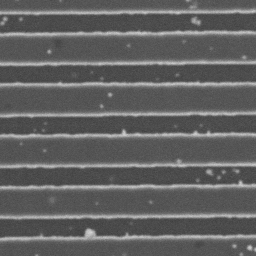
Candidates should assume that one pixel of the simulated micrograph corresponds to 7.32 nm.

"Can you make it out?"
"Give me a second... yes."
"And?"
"lines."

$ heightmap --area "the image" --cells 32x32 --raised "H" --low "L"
HHHHHHHHHHHHHHHHHHHHHHHHHHHHHHHH
HHHHHHHHHHHHHHHHHHHHHHHHHHHHHLHL
LLLLLLLLLLLLLLLLLLLLLLLLLLLLLLLL
LLLLLLLLLLLLLLLLLLLLLLLLLLLLLLLL
HHHHHHHHHHHHHHHHHHHHHHHHHHHHHHHH
HHHHHHHHHHHHHHHHHHHHHHHHHHHHHHHH
HHHHHHHHHHHHHHHHHHHHHHHHHHHHHHHH
HHHHHHHHHHHHHHHHHHHHHHHHHHHHHHHH
LLLLLLLLLLLLLLLLLLLLLLLLLLLLLLLL
LLLLLLLLLLLLLLLLLLLLLLLLLLLLLLLL
HHHHHHHHHHHHHHHHHHHHHHHHHHHHHHHH
HHHHHHHHHHHHHHHHHHHHHHHHHHHHHHHH
HHHHHHHHHHHHHHHHHHHHHHHHHHHHHHHH
HHHHHHHHHHHHHHHHHHHHHHHHHHHHHHHH
HLLLLLLLLLLLLLLLLLLLLLLLLLLLLLLL
LLLLLLLLLLLLLLLLLLLLLLLLLLLLLLLL
LLLLLLLLLLLLLLLLLLLLLLLLLLLLLLLL
HHHHHHHHHHHHHHHHHHHHHHHHHHHHHHHH
HHHHHHHHHHHHHHHHHHHHHHHHHHHHHHHH
HHHHHHHHHHHHHHHHHHHHHHHHHHHHHHHH
HHHHHHHHHHHHHHHHHHHHHHHHHHHHHHHH
LLLLLLLLLLLLLLLLLLLLLLLLLLLLLLLL
LLLLLLLLLLLLLLLLLLLLLLLLLLLLLLLL
HHHHHHHHHHHHHHHHHHHHHHHHHHHHHHHH
HHHHHHHHHHHHHHHHHHHHHHHHHHHHHHHH
HHHHHHHHHHHHHHHHHHHHHHHHHHHHHHHH
HHHHHHHHHHHHHHHHHHHHHHHHHHHHHHHH
LLLLLLLLLLLLLLLLLLLLLLLLLLLLLLLL
LLLLLLLLLLLLLLLLLLLLLLLLLLLLLLLL
LLLLLLLLLLHHLLLLLLLLLHHHHHHHHHHH
HHHHHHHHHHHHHHHHHHHHHHHHHHHHHHHH
HHHHHHHHHHHHHHHHHHHHHHHHHHHHHHHH